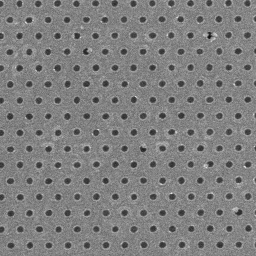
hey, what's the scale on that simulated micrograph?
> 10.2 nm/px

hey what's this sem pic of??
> a regular array of holes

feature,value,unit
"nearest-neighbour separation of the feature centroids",187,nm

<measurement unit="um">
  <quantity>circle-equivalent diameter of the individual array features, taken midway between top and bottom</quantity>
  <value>0.0706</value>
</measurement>